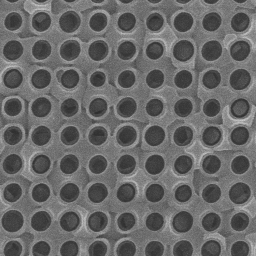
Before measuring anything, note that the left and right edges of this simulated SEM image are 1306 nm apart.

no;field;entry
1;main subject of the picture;a regular array of holes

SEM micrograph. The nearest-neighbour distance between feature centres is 144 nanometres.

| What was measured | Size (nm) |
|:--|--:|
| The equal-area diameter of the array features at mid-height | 98.4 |